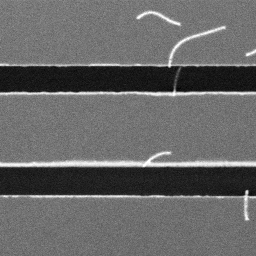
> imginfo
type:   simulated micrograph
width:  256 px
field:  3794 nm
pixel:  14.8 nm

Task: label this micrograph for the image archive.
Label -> lines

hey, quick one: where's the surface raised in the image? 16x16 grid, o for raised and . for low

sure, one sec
oooooooooooooooo
oooooooooooooooo
oooooooooooooooo
oooooooooooooooo
................
................
oooooooooooooooo
oooooooooooooooo
oooooooooooooooo
oooooooooooooooo
................
................
oooooooooooooooo
oooooooooooooooo
oooooooooooooooo
oooooooooooooooo